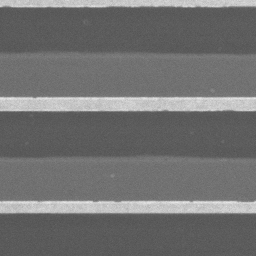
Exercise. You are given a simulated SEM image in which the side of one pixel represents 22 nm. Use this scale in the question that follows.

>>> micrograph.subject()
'lines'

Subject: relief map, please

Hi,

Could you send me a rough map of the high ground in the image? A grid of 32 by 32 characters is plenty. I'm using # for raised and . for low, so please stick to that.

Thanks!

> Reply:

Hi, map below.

################################
................................
................................
................................
................................
................................
................................
################################
################################
################################
################################
################################
################################
################################
................................
................................
................................
................................
................................
................................
################################
################################
################################
################################
################################
################################
################################
................................
................................
................................
................................
................................